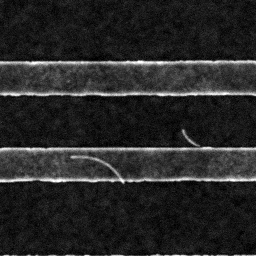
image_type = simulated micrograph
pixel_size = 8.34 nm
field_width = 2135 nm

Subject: lines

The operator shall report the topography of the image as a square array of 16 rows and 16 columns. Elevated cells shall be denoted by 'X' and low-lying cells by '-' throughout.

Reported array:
----------------
----------------
----------------
----------------
XXXXXXXXXXXXXXXX
XXXXXXXXXXXXXXXX
----------------
----------------
----------------
XXXXXXXXXXXXXXXX
XXXXXXXXXXXXXXXX
----------------
----------------
----------------
----------------
----------------